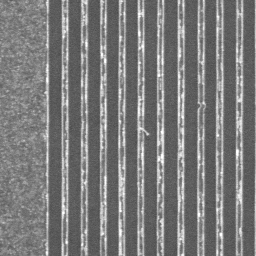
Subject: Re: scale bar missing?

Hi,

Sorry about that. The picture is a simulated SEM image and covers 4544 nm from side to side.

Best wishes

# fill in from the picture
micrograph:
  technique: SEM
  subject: parallel lines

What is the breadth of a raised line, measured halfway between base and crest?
97.6 nm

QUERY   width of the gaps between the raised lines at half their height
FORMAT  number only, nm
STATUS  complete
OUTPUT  248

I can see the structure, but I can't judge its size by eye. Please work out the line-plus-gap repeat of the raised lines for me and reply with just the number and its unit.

344 nanometres